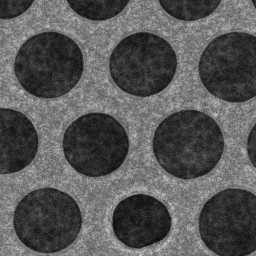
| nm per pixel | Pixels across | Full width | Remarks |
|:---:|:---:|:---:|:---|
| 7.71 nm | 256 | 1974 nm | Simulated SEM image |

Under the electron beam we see holes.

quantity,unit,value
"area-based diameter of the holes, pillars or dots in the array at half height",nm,517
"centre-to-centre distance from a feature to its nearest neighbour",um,0.696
